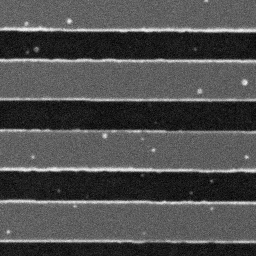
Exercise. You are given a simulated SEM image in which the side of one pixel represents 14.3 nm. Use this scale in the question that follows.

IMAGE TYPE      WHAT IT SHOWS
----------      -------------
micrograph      lines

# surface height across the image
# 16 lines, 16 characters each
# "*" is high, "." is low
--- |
****************
****************
................
................
****************
****************
................
................
****************
****************
****************
................
................
****************
****************
................